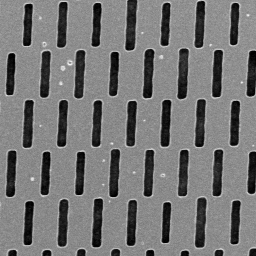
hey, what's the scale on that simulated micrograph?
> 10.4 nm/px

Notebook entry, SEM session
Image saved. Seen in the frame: a regular array of holes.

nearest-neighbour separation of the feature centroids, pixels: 34.4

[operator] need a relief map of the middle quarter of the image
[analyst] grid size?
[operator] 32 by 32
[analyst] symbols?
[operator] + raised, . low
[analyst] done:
+++..++++++...++++++...+++++...+
+++..++++++...++++++...+++++...+
+++..++++++...++++++..++++++...+
+++..++++++...++++++..++++++...+
+++..++++++...++++++..++++++...+
+++..++++++...++++++..++++++...+
+++..++++++..+++++++..++++++...+
++...++++++..+++++++..++++++...+
+++.++++++++++++++++.+++++++..++
.+++++++.+++++++..+++++++..+++++
.++++++...++++++..++++++...+++++
.++++++...++++++..++++++...+++++
.++++++...++++++..++++++...+++++
.++++++..+++++++..++++++...+++++
.++++++..+++++++..++++++...+++++
.++++++..+++++++..++++++...+++++
.++++++..+++++++..++++++...+++++
.++++++..+++++++..++++++...+++++
.++++++..+++++++..++++++...+++++
.++++++..++++++...++++++..++++++
+++++++..+++++++.+++++++..++++++
++++++++++++..+++++++.++++++++.+
+++..+++++++..++++++...++++++..+
+++..+++++++..++++++...++++++..+
+++..+++++++..++++++...++++++..+
+++..++++++...++++++...++++++..+
+++..++++++...++++++..+++++++..+
+++..++++++...++++++..+++++++..+
+++..++++++...++++++..+++++++..+
+++..++++++...++++++..+++++++..+
+++..++++++...++++++..+++++++..+
+++..++++++...++++++..++++++...+